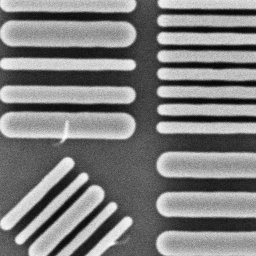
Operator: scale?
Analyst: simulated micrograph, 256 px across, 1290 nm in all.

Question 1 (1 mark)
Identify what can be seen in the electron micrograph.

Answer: groups of lines, slits or small figures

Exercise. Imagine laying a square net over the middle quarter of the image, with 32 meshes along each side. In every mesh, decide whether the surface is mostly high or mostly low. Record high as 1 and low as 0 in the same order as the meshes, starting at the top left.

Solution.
11111111111111111100000000000000
00000001100000011000000011111111
00000000000000000000000011111111
00000000000000000000000011111111
00000000000000000000000000000000
00000000000000000000000000000000
11111111111111111000000011111111
11111111111111111100000011111111
11111111111111111100000000000000
11111111111111111000000000000000
00000000000000000000000011111111
00000000000000000000000011111111
11111111111111110000000011111111
11111111111111111000000000000000
11111111111111111100000000000000
11111111111111111100000111111111
11111111111111111100000111111111
11111111111111111000000000000000
10000000001111110000000000000000
00000000000000000000000000000000
00000000000000000000000000000000
00000000000000000000000000000000
00000000000000000000000001111111
11000000000000000000000011111111
11000000000000000000000111111111
11000000000000000000000111111111
10000000000000000000000011111111
00001100000000000000000011111111
00011100000000000000000000000000
00111000000000000000000000000000
01110001000000000000000000000000
11100011110000000000000000000000